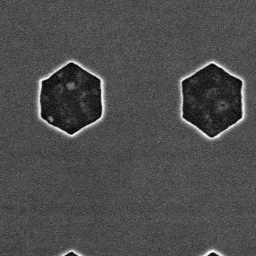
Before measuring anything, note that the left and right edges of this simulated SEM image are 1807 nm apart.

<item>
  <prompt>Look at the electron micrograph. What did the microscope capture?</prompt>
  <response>holes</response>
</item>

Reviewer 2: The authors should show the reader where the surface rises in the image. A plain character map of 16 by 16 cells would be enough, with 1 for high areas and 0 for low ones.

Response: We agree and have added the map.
1111111111111111
1111111111111111
1111111111111111
1111111111111111
1111001111110011
1110001111100001
1110001111100001
1110001111110001
1111111111111111
1111111111111111
1111111111111111
1111111111111111
1111111111111111
1111111111111111
1111111111111111
1111111111111111